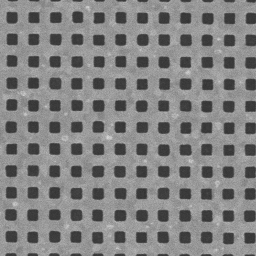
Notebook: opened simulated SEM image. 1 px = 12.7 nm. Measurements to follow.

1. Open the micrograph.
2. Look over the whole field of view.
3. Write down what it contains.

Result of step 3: a regular array of holes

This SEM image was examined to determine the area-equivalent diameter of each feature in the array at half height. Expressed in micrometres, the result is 0.163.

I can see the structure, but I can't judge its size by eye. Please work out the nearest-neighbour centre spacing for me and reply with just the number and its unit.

0.272 um